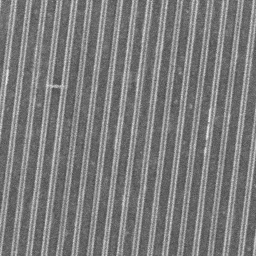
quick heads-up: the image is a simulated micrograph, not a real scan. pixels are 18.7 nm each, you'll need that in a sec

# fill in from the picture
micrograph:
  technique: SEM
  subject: parallel lines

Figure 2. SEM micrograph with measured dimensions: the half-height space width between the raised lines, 10.2 px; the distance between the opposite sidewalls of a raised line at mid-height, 86 nm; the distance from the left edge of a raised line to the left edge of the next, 281 nanometres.